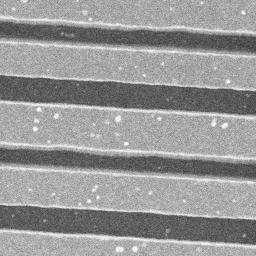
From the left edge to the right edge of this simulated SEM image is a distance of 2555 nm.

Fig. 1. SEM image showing lines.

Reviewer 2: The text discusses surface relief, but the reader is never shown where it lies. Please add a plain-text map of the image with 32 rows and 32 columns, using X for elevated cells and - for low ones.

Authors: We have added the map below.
XXXXXXXXXXXXXXXXXXXXXXXXXXXXXXXX
XXXXXXXXXXXXXXXXXXXXXXXXXXXXXXXX
--XXXXXXXXXXXXXXXXXXXXXXXXXXXXXX
-------------------XXX-XXXXXXXXX
--------------------------------
XXXXX---------------------------
XXXXXXXXXXXXXXXXXXXXXXX---------
XXXXXXXXXXXXXXXXXXXXXXXXXXXXXXXX
XXXXXXXXXXXXXXXXXXXXXXXXXXXXXXXX
---XXXXXXXXXXXXXXXXXXXXXXXXXXXXX
------------------XXXXXXXXXXXXXX
--------------------------------
--------------------------------
XXXXXXXXXXXX--------------------
XXXXXXXXXXXXXXXXXXXXXXXXXXXXXX--
XXXXXXXXXXXXXXXXXXXXXXXXXXXXXXXX
XXXXXXXXXXXXXXXXXXXXXXXXXXXXXXXX
XXXXXXXXXXXXXXXXXXXXXXXXXXXXXXXX
---------XXXXXXXXXXXXXXXXXXXXXXX
-------------------------XXXXXXX
--------------------------------
XXXXXXXXXX----------------------
XXXXXXXXXXXXXXXXXXXXXXXXXX------
XXXXXXXXXXXXXXXXXXXXXXXXXXXXXXXX
XXXXXXXXXXXXXXXXXXXXXXXXXXXXXXXX
XXXXXXXXXXXXXXXXXXXXXXXXXXXXXXXX
-------------------XXXXXXXXXXXXX
--------------------------------
--------------------------------
XXXXXXXXXXX---------------------
XXXXXXXXXXXXXXXXXXXXXXXXXXX-----
XXXXXXXXXXXXXXXXXXXXXXXXXXXXXXXX